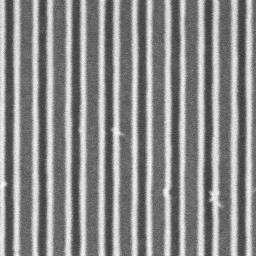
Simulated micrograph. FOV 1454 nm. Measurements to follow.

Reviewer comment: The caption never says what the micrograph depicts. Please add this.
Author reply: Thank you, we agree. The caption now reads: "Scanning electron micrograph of parallel lines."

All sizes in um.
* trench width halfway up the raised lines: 0.0533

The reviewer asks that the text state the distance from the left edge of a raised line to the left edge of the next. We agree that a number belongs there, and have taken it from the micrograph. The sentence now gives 94.2 nanometres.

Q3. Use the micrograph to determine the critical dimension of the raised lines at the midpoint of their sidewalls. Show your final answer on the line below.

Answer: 31.3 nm